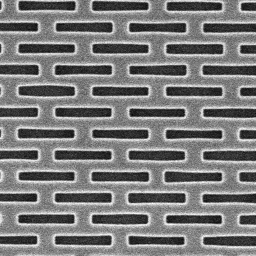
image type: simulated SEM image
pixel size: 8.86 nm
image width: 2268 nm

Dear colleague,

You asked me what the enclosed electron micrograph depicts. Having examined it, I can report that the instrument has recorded groups of lines, slits or small figures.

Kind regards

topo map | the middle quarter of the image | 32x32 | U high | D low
DDDDDDDDDDDDUUUUUDDDDDDDDDDDDDUU
DDDDDDDDDDDDUUUUDDDDDDDDDDDDDDDU
DDDDDDDDDDDDUUUUDDDDDDDDDDDDDDDU
UUUUUUUUUUUUUUUUUUUUUUUUUUUUUUUU
UUUUUUUUUUUUUUUUUUUUUUUUUUUUUUUU
DDUUUUUUDDDDDDUUUUUUUUUUUUDDDDDD
DDDUUUUDDDDDDDDDDDDDDUUUUDDDDDDD
DDDUUUUDDDDDDDDDDDDDDUUUUDDDDDDD
UUUUUUUUUUUUUUUUUUUUUUUUUUUUUUUU
UUUUUUUUUUUUUUUUUUUUUUUUUUUUUUUU
UUUUUUUUUUUUUUUUUUUUUUUUUUUUUUUU
DDDDDDDDDDDDUUUUDDDDDDDDDDDDDDUU
DDDDDDDDDDDDUUUUDDDDDDDDDDDDDDUU
UUUUUUUUUUUUUUUUUUUUUUUUUUUUUUUU
UUUUUUUUUUUUUUUUUUUUUUUUUUUUUUUU
UUUUUUUUUUUUUUUUUUUUUUUUUUUUUUUU
DDUUUUUUDDDDDDDDDDDDDUUUUUDDDDDU
DDDUUUUDDDDDDDDDDDDDDUUUUDDDDDDD
DDUUUUUUDDDDDDDDDDDDDUUUUUDDDDDD
UUUUUUUUUUUUUUUUUUUUUUUUUUUUUUUU
UUUUUUUUUUUUUUUUUUUUUUUUUUUUUUUU
DDDDUUUUUUUUUUUUUDUUUUUDDDDUUUUU
DDDDDDDDDDDDUUUUDDDDDDDDDDDDDDUU
DDDDDDDDDDDDUUUUDDDDDDDDDDDDDDUU
UUUUUUUUUUUUUUUUUUUUUUUUUUUUUUUU
UUUUUUUUUUUUUUUUUUUUUUUUUUUUUUUU
UUUUUUUUUUUUUUUUUUUUUUUUUUUUUUUU
DDDUUUUDDDDDDDDDDDDDDUUUUDDDDDDD
DDDUUUUDDDDDDDDDDDDDDDUUUDDDDDDD
UUUUUUUUDDDDDDDDDDDDDUUUUDDDDDDD
UUUUUUUUUUUUUUUUUUUUUUUUUUUUUUUU
UUUUUUUUUUUUUUUUUUUUUUUUUUUUUUUU